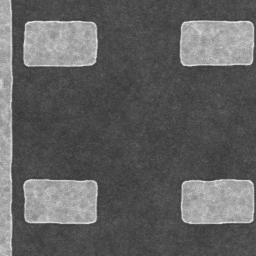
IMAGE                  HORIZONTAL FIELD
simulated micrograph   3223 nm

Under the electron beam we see wiring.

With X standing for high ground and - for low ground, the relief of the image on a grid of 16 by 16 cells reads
X---------------
X-XXXX------XXXX
X-XXXX-----XXXXX
X-XXXX-----XXXXX
X---------------
X---------------
X---------------
X---------------
X---------------
X---------------
X---------------
X-XXXX------XXXX
X-XXXX-----XXXXX
X-XXXX-----XXXXX
X---------------
X---------------